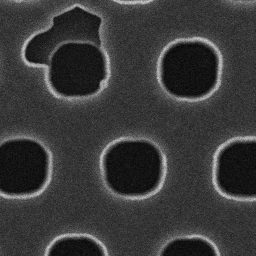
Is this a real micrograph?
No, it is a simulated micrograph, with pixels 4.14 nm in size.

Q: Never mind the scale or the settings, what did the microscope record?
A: holes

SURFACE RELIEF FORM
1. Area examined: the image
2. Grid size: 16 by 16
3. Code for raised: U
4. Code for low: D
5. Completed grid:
UUUUUUUUUUUUUUUU
UUUDDDUUUUUUUUUU
UUDDDDUUUUUUUUUU
UUDDDDUUUUDDDUUU
UUUDDDDUUUDDDDUU
UUUDDDUUUUDDDUUU
UUUUUUUUUUUUUUUU
UUUUUUUUUUUUUUUU
UUUUUUUUUUUUUUUU
DDDUUUUDDDUUUUDD
DDDUUUUDDDUUUUDD
DDDUUUUDDDUUUUDD
UUUUUUUUUUUUUUUU
UUUUUUUUUUUUUUUU
UUUUUUUUUUUUUUUU
UUUDDDUUUUDDDUUU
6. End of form